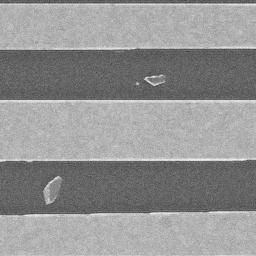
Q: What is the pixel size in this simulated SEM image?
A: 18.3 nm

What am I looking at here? lines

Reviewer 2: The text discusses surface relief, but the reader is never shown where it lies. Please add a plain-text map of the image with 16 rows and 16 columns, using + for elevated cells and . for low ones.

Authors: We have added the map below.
++++++++++++++++
++++++++++++++++
++++++++++++++++
................
................
................
++++++++++++++++
++++++++++++++++
++++++++++++++++
++++++++++++++++
................
................
................
.+++++++++++++++
++++++++++++++++
++++++++++++++++